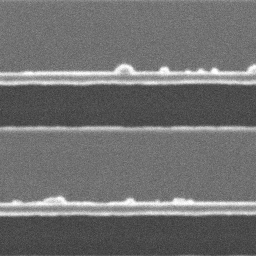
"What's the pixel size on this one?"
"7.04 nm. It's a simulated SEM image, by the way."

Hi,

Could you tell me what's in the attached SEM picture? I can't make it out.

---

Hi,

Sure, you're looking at lines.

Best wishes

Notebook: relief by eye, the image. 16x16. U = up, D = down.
UUUUUUUUUUUUUUUU
UUUUUUUUUUUUUUUU
UUUUUUUUUUUUUUUU
UUUUUUUUUUUUUUUU
UUUUUUUUUUUUUUUU
DDDDDDDDDDDDDDDD
DDDDDDDDDDDDDDDD
DDDDDDDDDDDDDDDD
UUUUUUUUUUUUUUUU
UUUUUUUUUUUUUUUU
UUUUUUUUUUUUUUUU
UUUUUUUUUUUUUUUU
UUUUUUUUUUUUUUUU
DDDDDDDDDDDDDDDD
DDDDDDDDDDDDDDDD
DDDDDDDDDDDDDDDD